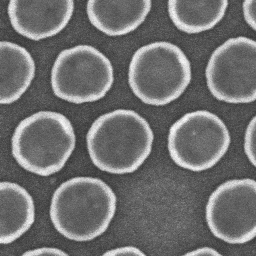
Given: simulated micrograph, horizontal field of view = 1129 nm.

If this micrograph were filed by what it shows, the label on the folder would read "raised bodies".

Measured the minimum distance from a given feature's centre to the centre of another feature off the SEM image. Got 0.337 µm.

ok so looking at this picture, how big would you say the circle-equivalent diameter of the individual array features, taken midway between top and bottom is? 256 nm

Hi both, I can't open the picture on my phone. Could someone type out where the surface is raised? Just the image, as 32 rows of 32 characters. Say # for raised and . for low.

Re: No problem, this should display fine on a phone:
.########..#######...#######...#
.########..#######...#######...#
..######....######....#####....#
..######.....###.......###......
....##..........................
............................####
###.....####.....#####.....#####
####...######....######...######
####...#######...######...######
####...#######..########..######
###....#######...######...######
###....######....#####.....#####
#........#........###........##.
................................
....###......####......###......
...#####....######....######...#
..#######..########..#######...#
..#######..########..#######...#
..#######..########..#######...#
..######....######....#####....#
...#####....#####......###......
.....#..........................
..........##....................
##......#####...............####
###....#######.............#####
####...#######............######
####...#######............######
####...#######............######
###....######..............#####
##.......##................####.
................................
....###.......###.......###.....